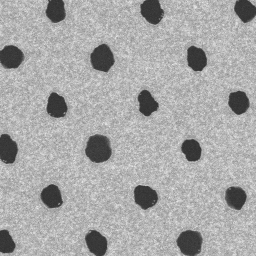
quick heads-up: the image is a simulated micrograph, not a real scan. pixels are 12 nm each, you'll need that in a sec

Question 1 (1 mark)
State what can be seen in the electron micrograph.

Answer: a regular array of holes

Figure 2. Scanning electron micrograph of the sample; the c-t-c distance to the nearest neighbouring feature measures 762 nanometres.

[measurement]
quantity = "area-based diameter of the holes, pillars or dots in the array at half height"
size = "268 nm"